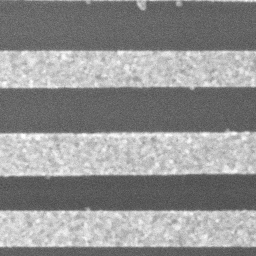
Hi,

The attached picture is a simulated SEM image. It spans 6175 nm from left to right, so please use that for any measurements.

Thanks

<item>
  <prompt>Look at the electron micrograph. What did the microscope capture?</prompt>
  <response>lines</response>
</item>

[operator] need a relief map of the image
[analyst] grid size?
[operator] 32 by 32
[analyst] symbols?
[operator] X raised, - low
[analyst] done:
--------------------------------
--------------------------------
--------------------------------
--------------------------------
--------------------------------
--------------------------------
XXXXXXXXXXXXXXXXXXXXXXXXXXXXXXXX
XXXXXXXXXXXXXXXXXXXXXXXXXXXXXXXX
XXXXXXXXXXXXXXXXXXXXXXXXXXXXXXXX
XXXXXXXXXXXXXXXXXXXXXXXXXXXXXXXX
XXXXXXXXXXXXXXXXXXXXXXXXXXXXXXXX
--------------------------------
--------------------------------
--------------------------------
--------------------------------
--------------------------------
--------------------------------
XXXXXXXXXXXXXXXXXXXXXXXXXXXXXXXX
XXXXXXXXXXXXXXXXXXXXXXXXXXXXXXXX
XXXXXXXXXXXXXXXXXXXXXXXXXXXXXXXX
XXXXXXXXXXXXXXXXXXXXXXXXXXXXXXXX
XXXXXXXXXXXXXXXXXXXXXXXXXXXXXXXX
--------------------------------
--------------------------------
--------------------------------
--------------------------------
XXXXXXXXXXXXXXXXXXXXXXXXXXXXXXXX
XXXXXXXXXXXXXXXXXXXXXXXXXXXXXXXX
XXXXXXXXXXXXXXXXXXXXXXXXXXXXXXXX
XXXXXXXXXXXXXXXXXXXXXXXXXXXXXXXX
XXXXXXXXXXXXXXXXXXXXXXXXXXXXXXXX
--------------------------------